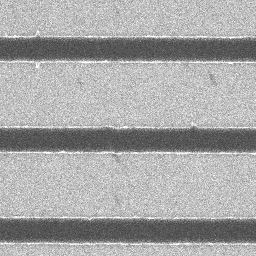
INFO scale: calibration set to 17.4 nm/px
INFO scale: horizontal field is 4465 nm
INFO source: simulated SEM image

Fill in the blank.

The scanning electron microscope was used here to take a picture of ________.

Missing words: one or a few lines or trenches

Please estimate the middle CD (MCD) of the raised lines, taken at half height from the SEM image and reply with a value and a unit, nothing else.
464 nm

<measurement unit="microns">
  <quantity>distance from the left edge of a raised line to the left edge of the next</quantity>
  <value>1.58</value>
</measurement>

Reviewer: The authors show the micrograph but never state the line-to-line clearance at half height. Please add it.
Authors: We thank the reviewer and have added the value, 1120 nm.